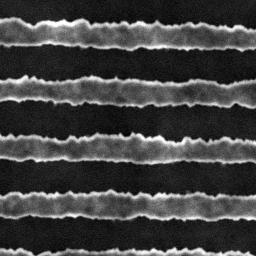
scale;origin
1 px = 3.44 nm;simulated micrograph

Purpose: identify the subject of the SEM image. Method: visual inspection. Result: lines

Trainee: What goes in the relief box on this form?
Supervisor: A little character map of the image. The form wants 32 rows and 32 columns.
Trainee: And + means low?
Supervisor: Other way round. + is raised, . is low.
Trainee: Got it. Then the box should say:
................................
................................
+++.......+.....................
+++++++++++++++++++++++++++++++.
++++++++++++++++++++++++++++++++
++++++++++++++++++++++++++++++++
................................
................................
................................
................................
+++++++++++++++++++++++++++..+++
++++++++++++++++++++++++++++++++
+++.++++++++++++++++++++++++++++
...............................+
................................
................................
................................
+++++++.+++++++++++++..++..++...
++++++++++++++++++++++++++++++++
++++++++++++++++++++++++++++++++
.................++.............
................................
................................
................................
++++++++++++++++++++++++++++++++
++++++++++++++++++++++++++++++++
++++++++++++++++++++++++++++++++
..........................+.....
................................
................................
................................
++++...+++++++++++++++++++..++..